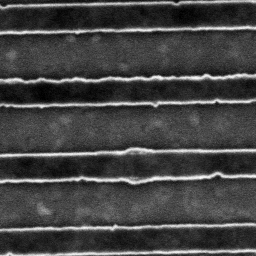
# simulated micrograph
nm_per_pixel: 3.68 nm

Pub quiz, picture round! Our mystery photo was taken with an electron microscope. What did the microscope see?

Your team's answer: one or a few lines or trenches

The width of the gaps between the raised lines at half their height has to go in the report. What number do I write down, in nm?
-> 175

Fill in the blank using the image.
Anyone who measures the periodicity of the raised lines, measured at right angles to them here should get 273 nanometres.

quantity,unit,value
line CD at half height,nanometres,98.3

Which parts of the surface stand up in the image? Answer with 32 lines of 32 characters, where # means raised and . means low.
................################
################################
################################
#############################..#
................................
................................
................................
................................
................................
.........................#...###
################################
################################
################################
................................
................................
................................
................................
................................
................................
################################
################################
################################
########....#######.............
................................
................................
................................
................................
................................
......#.#...####.###############
################################
################################
#######################...#.....